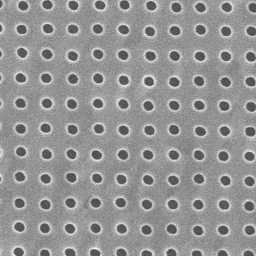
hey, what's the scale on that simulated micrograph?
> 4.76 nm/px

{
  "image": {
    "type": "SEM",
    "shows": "a regular array of holes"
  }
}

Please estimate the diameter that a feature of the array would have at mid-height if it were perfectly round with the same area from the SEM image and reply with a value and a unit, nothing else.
10.1 px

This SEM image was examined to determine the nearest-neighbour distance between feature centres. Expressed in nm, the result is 116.